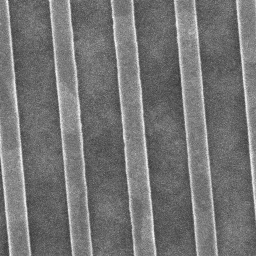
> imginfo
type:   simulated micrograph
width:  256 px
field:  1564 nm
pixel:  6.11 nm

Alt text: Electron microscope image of one or a few lines or trenches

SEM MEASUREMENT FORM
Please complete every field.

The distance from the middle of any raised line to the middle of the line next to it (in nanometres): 379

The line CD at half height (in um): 0.124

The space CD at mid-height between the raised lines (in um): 0.254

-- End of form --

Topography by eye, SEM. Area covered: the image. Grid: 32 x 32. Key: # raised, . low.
#.....###.....###.....##......##
#.....###.....###.....##......##
#.....###.....###.....###.....##
#.....###.....###.....###.....##
#......##.....###.....###.....##
#......##.....###.....###.....##
#......##......##.....###.....##
##.....##......##.....###.....##
##.....###.....##......##.....##
##.....###.....##......##.....##
##.....###.....##......##......#
##.....###.....###.....##......#
##.....###.....###.....##......#
##......##.....###.....###.....#
##......##.....###.....###.....#
##......##.....###.....###.....#
##......##.....###.....###.....#
##......##......##.....###.....#
###.....##......##.....###.....#
###.....##......##......##.....#
###.....###.....##......##.....#
###.....###.....##......##......
###.....###.....###.....##......
.##.....###.....###.....##......
.##.....###.....###.....###.....
.##.....###.....###.....###.....
.##......##.....###.....###.....
.##......##.....###.....###.....
.##......##......##.....###.....
.###.....##......##.....###.....
.###.....##......##......##.....
.###.....###.....##......##.....